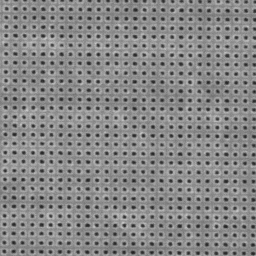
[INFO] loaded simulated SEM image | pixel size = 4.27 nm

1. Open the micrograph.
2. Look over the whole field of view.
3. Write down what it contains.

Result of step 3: a regular array of holes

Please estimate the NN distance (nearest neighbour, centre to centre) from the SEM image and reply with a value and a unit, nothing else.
8.55 pixels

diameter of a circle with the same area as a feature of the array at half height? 21.5 nanometers